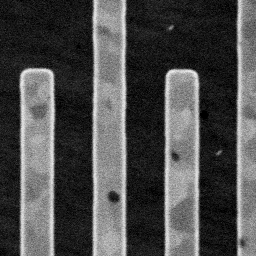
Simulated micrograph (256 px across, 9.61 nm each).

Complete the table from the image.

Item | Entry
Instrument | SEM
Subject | wiring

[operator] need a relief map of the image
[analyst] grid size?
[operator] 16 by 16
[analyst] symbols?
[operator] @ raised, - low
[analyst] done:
------@@-------@
------@@-------@
------@@-------@
------@@-------@
--@---@@---@---@
-@@---@@--@@---@
-@@---@@--@@---@
-@@---@@--@@---@
-@@---@@--@@---@
-@@---@@--@@---@
-@@---@@--@@---@
-@@---@@--@@---@
-@@---@@--@@---@
-@@---@@--@@---@
-@@---@@--@@---@
-@@---@@--@@---@